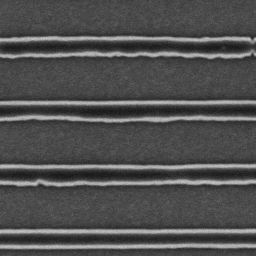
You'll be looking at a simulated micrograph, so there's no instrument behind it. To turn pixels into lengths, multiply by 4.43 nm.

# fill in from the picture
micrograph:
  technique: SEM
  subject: one or a few lines or trenches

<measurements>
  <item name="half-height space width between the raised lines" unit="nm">209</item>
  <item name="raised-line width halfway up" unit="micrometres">0.0765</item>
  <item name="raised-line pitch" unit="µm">0.284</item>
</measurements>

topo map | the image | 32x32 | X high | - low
--------------------------------
--------------------------------
--------------------------------
--------------------------------
--------------------------------
XXXXXXXXXXXXXXXXXXXXXXXXXXXXXXXX
XXXXXXXXXXXXXXXXXXXXXXXXXXXXXXXX
--------------------------------
--------------------------------
--------------------------------
--------------------------------
--------------------------------
--------------------------------
XXXXXXXXXXXXXXXXXXXXXXXXXXXXXXXX
XXXXXXXXXXXXXXXXXXXXXXXXXXXXXXXX
--------------------------------
--------------------------------
--------------------------------
--------------------------------
--------------------------------
--------------------------------
XXXXXXXXXXXXXXXXXXXXXXXXXXXXXXXX
XXXXXXXXXXXXXXXXXXXXXXXXXXXXXXXX
--------------------------------
--------------------------------
--------------------------------
--------------------------------
--------------------------------
--------------------------------
XXXXXXXXXXXXXXXXXXXXXXXXXXXXXXXX
XXXXXXXXXXXXXXXXXXXXXXXXXXXXXXXX
--------------------------------